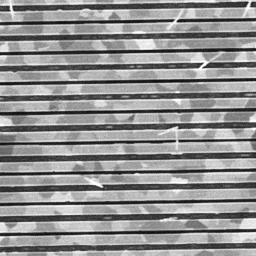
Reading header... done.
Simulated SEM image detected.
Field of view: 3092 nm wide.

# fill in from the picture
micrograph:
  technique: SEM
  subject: parallel lines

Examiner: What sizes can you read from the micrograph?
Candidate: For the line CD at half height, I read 109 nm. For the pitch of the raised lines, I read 181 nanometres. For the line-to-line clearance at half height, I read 72.5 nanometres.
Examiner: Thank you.